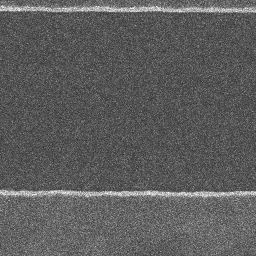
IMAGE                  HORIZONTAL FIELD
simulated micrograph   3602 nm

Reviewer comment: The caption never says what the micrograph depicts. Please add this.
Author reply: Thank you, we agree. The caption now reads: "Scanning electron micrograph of one or a few lines or trenches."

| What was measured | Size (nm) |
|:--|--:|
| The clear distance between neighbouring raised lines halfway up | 2560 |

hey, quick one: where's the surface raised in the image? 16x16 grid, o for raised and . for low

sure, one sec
oooooooooooooooo
................
................
................
................
................
................
................
................
................
................
................
oooooooooooooooo
oooooooooooooooo
oooooooooooooooo
oooooooooooooooo